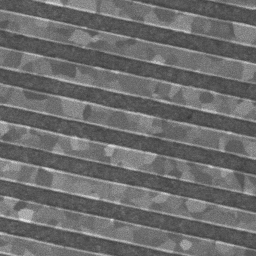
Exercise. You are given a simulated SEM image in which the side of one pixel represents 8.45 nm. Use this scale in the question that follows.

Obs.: parallel lines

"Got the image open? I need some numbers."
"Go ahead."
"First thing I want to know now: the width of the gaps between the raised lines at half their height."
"150 nanometres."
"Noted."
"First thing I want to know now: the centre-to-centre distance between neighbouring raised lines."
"307 nm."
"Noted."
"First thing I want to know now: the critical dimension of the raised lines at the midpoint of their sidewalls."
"159 nm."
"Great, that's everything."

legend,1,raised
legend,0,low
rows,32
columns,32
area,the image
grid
00000001111111111100000000000111
10000000000111111111111000000000
11111100000000001111111111100000
11111111111000000000011111111111
00001111111111100000000001111111
00000000011111111111000000000011
11100000000001111111111110000000
11111110000000000011111111111000
01111111111100000000000111111111
00000011111111111000000000011111
00000000001111111111110000000000
11110000000000011111111111000000
11111111100000000000111111111110
00111111111111000000000011111111
00000001111111111100000000000111
10000000000011111111111000000000
11111100000000000111111111110000
11111111110000000000011111111111
00001111111111100000000000111111
00000000011111111111000000000001
11100000000001111111111110000000
11111110000000000011111111111100
01111111111100000000000111111111
00000111111111111000000000011111
00000000000111111111110000000000
11111000000000011111111111100000
11111111100000000000111111111110
00011111111111000000000011111111
00000000111111111110000000000111
11000000000011111111111100000000
11111100000000000111111111110000
11111111111000000000001111111111